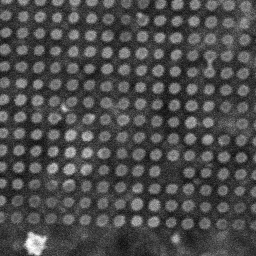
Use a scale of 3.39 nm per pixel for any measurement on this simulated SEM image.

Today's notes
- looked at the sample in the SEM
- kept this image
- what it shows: a regular array of raised bodies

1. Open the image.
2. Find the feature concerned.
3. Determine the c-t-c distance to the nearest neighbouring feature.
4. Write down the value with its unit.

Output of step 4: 55.8 nm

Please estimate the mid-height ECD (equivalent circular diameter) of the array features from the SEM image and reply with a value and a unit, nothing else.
34.4 nanometres